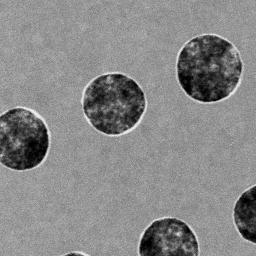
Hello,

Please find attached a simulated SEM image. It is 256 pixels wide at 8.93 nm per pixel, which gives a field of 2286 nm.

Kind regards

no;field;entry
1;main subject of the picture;holes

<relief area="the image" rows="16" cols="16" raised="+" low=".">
++++++++++++++++
++++++++++++++++
++++++++++++..++
+++++++++++....+
+++++++++++....+
+++++....++....+
+++++....+++++++
...+++...+++++++
...+++++++++++++
...+++++++++++++
+.++++++++++++++
++++++++++++++++
+++++++++++++++.
+++++++++++++++.
+++++++++...+++.
+++++++++...++++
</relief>